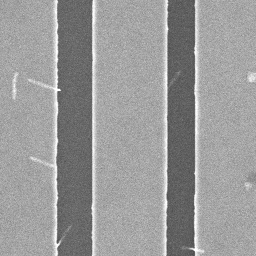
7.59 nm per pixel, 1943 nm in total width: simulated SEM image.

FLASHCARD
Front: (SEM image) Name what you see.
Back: lines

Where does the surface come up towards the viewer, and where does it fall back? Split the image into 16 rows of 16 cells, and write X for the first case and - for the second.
XXXX--XXXX--XXXX
XXXX--XXXX--XXXX
XXXX--XXXX--XXXX
XXXX--XXXX--XXXX
XXXX--XXXX--XXXX
XXXX--XXXX--XXXX
XXXX--XXXX--XXXX
XXXX--XXXX--XXXX
XXXX--XXXX--XXXX
XXXX--XXXX--XXXX
XXXX--XXXX--XXXX
XXXX--XXXX--XXXX
XXXX--XXXX--XXXX
XXXX--XXXX--XXXX
XXXX--XXXX--XXXX
XXXX--XXXX--XXXX